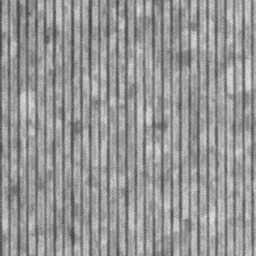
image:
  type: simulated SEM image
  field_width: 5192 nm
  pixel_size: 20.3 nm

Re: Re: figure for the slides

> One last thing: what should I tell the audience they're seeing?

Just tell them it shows parallel lines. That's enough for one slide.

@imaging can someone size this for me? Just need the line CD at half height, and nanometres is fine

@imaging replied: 104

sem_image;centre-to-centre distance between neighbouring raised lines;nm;183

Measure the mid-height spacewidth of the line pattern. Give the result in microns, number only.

0.0862